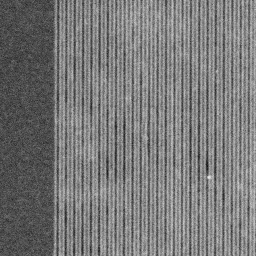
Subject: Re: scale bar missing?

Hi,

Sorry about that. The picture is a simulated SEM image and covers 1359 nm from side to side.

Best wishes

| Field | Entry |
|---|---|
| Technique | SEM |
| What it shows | parallel lines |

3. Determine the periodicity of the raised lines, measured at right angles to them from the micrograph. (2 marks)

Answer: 44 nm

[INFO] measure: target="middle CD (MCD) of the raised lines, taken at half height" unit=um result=0.0299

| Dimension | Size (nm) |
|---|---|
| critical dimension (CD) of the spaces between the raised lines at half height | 14.6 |